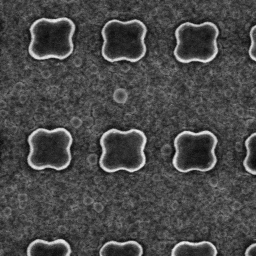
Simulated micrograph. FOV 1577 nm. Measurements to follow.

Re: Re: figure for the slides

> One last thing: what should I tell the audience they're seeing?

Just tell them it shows raised bodies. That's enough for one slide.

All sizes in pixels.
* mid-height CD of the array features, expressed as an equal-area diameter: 43.2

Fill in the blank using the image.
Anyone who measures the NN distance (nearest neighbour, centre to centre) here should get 445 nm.